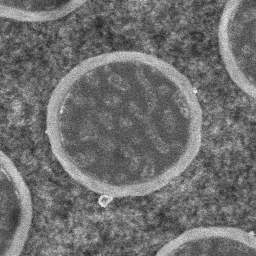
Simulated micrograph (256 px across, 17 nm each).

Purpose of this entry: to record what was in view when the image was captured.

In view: raised bodies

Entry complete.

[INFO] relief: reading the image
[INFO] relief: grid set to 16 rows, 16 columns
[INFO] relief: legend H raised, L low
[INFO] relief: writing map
HHHHLLLLLLLLLLHH
LLLLLLLLLLLLLLHH
LLLLLLLLLLLLLLHH
LLLLLLLLLLLLLLHH
LLLLLHHHHHHLLLLH
LLLLHHHHHHHHLLLL
LLLHHHHHHHHHLLLL
LLLHHHHHHHHHLLLL
LLLHHHHHHHHHLLLL
LLLLHHHHHHHHLLLL
HLLLHHHHHHHLLLLL
HLLLLLHHHHLLLLLL
HHLLLLLLLLLLLLLL
HHLLLLLLLLLLLLLL
HLLLLLLLLLLLLLLL
HLLLLLLLLLLHHHHH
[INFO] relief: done